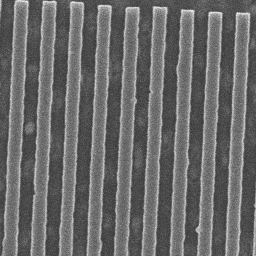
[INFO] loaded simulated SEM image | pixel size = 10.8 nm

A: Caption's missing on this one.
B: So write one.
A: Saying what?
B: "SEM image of parallel lines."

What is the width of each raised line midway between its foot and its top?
135 nanometres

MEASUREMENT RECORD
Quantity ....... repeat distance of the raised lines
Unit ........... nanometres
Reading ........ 299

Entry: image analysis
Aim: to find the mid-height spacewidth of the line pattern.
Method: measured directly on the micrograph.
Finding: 163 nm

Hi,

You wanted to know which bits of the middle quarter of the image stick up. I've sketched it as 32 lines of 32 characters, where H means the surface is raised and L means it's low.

LHHHLLLLHHHLLLLHHHLLLLHHHLLLHHHH
LHHHLLLLHHHLLLLHHHLLLLHHHLLLHHHH
LHHHLLLLHHHLLLLHHHLLLLHHHLLLHHHH
LHHHLLLLHHHLLLLHHHLLLLHHHLLLLHHH
LHHHLLLLHHHLLLLHHHLLLLHHHLLLLHHH
LHHHLLLLHHHLLLLHHHLLLLHHHLLLHHHH
LHHHLLLLHHHLLLLHHHLLLLHHHLLLHHHH
LHHHLLLLHHHLLLLHHHLLLHHHHLLLHHHH
LHHHLLLLHHHLLLHHHHLLLHHHHLLLHHHL
LHHHLLLLHHLLLLHHHHLLLHHHLLLLHHHL
LHHLLLLLHHHLLLHHHHLLLHHHLLLLHHHL
LHHLLLLLHHHLLLHHHLLLLHHHLLLLHHHL
HHHLLLLLHHHLLLHHHLLLLHHHLLLLHHHL
HHHLLLLLHHLLLLHHHLLLLHHHLLLLHHHL
HHHLLLLHHHLLLLHHHLLLLHHHLLLLHHHL
LHHLLLLHHHLLLLHHHLLLLHHHLLLLHHHL
HHHLLLLHHHLLLLHHHLLLLHHHLLLLHHHL
HHHLLLLHHHLLLLHHHLLLLHHHLLLLHHHL
HHHLLLLHHHLLLLHHHLLLLHHHLLLLHHHL
HHHLLLLHHHLLLLHHHLLLLHHHLLLLHHHL
HHHLLLLHHHLLLLHHHLLLLHHHLLLLHHHL
HHHLLLLHHHLLLLHHHLLLLHHHLLLLHHHL
HHHLLLLHHHLLLLHHHLLLLHHHLLLLHHHL
HHHLLLLHHHLLLLHHHLLLLHHHLLLLHHHL
HHHLLLLHHHLLLLHHHLLLLHHHLLLLHHHL
HHHLLLLHHHLLLLHHHLLLLHHHLLLLHHHL
HHHLLLLHHHLLLLHHHLLLLHHHLLLHHHHL
HHHLLLLHHHLLLHHHHLLLLHHHLLLHHHHL
HHHLLLLHHHLLLHHHHLLLHHHHLLLLHHHL
HHHLLLLHHLLLLLHHHLLLHHHHLLLHHHLL
HHHLLLLHHHLLLHHHHLLLHHHHLLLHHHLL
HHHLLLHHHLLLLHHHHLLLHHHLLLLHHHLL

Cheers